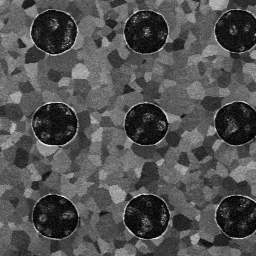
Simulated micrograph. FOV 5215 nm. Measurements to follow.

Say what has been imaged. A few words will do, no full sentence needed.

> holes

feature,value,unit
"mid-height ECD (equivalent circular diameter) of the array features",915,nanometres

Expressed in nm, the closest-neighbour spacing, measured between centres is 1860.